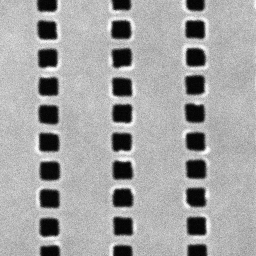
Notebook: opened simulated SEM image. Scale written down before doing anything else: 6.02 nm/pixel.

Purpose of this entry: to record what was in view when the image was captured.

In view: a regular array of holes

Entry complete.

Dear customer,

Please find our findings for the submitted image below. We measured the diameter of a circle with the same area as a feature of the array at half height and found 21.8 px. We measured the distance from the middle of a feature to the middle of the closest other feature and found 168 nanometres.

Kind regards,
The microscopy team